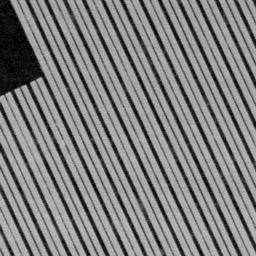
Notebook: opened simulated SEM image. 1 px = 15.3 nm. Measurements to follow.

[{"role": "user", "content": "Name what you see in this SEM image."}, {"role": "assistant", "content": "parallel lines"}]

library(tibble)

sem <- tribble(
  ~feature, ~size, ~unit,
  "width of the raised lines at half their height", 0.0762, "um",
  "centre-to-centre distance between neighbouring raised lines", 0.131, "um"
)